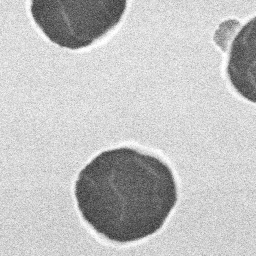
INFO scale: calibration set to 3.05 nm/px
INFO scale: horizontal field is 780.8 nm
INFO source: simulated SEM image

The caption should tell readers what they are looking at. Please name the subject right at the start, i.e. holes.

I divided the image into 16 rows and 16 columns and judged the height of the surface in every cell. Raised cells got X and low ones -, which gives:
XX------XXXXXXXX
XX-----XXXXXXXX-
XXX---XXXXXXXXX-
XXXXXXXXXXXXXX--
XXXXXXXXXXXXXX--
XXXXXXXXXXXXXXX-
XXXXXXXXXXXXXXXX
XXXXXXXXXXXXXXXX
XXXXXXXXXXXXXXXX
XXXXXX----XXXXXX
XXXXX------XXXXX
XXXXX------XXXXX
XXXXX------XXXXX
XXXXX-----XXXXXX
XXXXXX----XXXXXX
XXXXXXXXXXXXXXXX